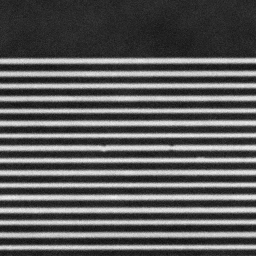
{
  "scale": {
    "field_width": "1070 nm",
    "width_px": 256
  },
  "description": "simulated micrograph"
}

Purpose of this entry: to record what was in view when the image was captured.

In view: parallel lines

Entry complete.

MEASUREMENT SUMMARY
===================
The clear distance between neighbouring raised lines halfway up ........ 32.9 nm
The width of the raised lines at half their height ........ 0.0204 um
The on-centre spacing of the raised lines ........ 51.9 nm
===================